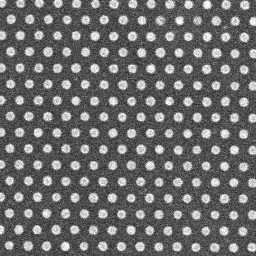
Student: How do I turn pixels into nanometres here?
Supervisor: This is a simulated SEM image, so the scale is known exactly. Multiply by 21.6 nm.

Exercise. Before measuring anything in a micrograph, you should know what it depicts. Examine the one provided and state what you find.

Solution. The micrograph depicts a regular array of raised bodies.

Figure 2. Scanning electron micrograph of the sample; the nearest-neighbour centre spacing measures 396 nm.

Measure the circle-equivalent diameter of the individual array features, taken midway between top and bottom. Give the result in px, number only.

8.29